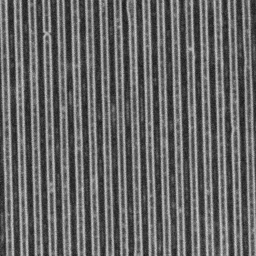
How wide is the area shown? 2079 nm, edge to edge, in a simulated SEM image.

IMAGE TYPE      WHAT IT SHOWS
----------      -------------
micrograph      parallel lines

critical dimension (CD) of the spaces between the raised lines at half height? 7.5 pixels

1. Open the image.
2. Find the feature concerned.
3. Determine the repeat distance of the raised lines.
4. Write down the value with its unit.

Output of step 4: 14.3 px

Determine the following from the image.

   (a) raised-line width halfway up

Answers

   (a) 53.8 nanometres